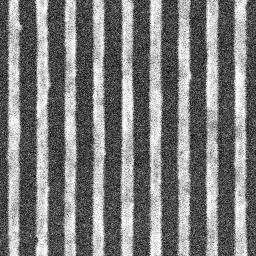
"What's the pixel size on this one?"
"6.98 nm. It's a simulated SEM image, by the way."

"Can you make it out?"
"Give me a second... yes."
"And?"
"parallel lines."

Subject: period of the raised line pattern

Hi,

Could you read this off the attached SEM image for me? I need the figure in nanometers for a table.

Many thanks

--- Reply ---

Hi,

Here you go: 198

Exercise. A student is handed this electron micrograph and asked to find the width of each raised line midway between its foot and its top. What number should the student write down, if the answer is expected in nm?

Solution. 63.7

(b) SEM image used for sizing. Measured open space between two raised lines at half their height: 133 nanometres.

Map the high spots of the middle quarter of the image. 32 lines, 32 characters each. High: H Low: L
LHHLLLLLHHLLLLLHHLLLLLHHLLLLLHHL
LHHLLLLLHHLLLLLHHLLLLLHHLLLLLHHL
LHHLLLLLHHLLLLLHHLLLLLHHLLLLLHHH
LHHLLLLLHHLLLLLHHLLLLLHHLLLLLHHL
LHHLLLLLHHLLLLLHHLLLLLHHLLLLLHHL
LHHLLLLLHHLLLLLHHLLLLLHHLLLLLHHL
HHHLLLLLHHLLLLLHHLLLLLHHLLLLLHHL
LHHLLLLHHHLLLLLHHLLLLLHHLLLLLHHL
LHHLLLLHHHLLLLLHHLLLLLHHLLLLLHHL
LHHLLLLLHHLLLLLHHLLLLLHHLLLLLHHL
LHHLLLLLHHLLLLLHHLLLLLHHLLLLLHHL
LHHLLLLLHHLLLLLHHLLLLLHHLLLLLHHL
HHHLLLLLHHLLLLLHHLLLLLHHLLLLLHHL
LHHLLLLLHHLLLLLHHLLLLLHHLLLLLHHL
LHHLLLLLHHLLLLLHHLLLLLHHLLLLLHHL
LHHLLLLLHHLLLLLHHLLLLLHHLLLLLHHL
LHHLLLLLHHLLLLLHHLLLLLHHLLLLLHHL
LHHLLLLLHHLLLLLHHLLLLLHHLLLLLHHL
LHHLLLLLHHLLLLLHHLLLLLHHLLLLLHHL
LHHLLLLLHHLLLLLHHLLLLLHHLLLLLHHL
LHHLLLLLHHLLLLLHHLLLLLHHLLLLLHHL
LHHLLLLLHHLLLLLHHLLLLLHHLLLLLHHL
LHHLLLLLHHLLLLLHHLLLLLHHLLLLLHHL
LHHLLLLLHHLLLLLHHLLLLLHHLLLLLHHL
LHHLLLLLHHLLLLLHHLLLLLHHLLLLLHHL
LHHLLLLLHHLLLLLHHLLLLLHHLLLLLHHL
LHHLLLLLHLLLLLLHHLLLLLHHLLLLLHHL
LHHLLLLLHHLLLLLHHLLLLLHHLLLLLHHL
LHHLLLLLHHLLLLLHHLLLLLHHLLLLLHHL
LHHLLLLLHHLLLLHHHLLLLLHHLLLLLHHL
LHHLLLLLHHLLLLHHHLLLLLHHLLLLLHHL
LHHLLLLLHHLLLLHHHLLLLLHHLLLLLHHL